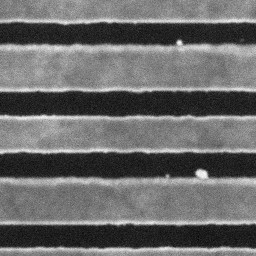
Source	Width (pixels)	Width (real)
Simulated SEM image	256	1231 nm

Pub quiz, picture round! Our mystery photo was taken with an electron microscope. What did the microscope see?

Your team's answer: lines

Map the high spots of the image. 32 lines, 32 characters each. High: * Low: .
********************************
********************************
********************************
................................
................................
......................*.........
********************************
********************************
********************************
********************************
********************************
................................
................................
................................
*....*.................*........
********************************
********************************
********************************
********************************
................................
................................
.........................*......
***....******....***************
********************************
********************************
********************************
********************************
********************************
................................
................................
................................
********************************